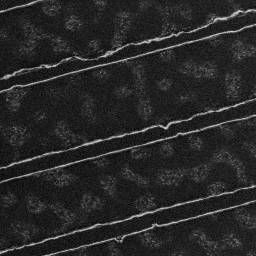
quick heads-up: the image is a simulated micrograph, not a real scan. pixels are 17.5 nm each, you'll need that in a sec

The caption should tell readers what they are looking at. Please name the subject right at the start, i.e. one or a few lines or trenches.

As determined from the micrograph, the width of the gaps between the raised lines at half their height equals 68.4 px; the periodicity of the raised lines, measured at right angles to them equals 1490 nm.